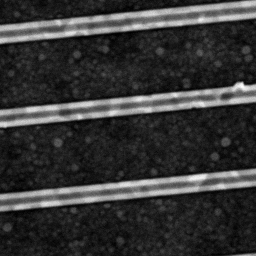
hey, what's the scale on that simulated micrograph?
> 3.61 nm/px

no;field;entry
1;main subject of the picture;one or a few lines or trenches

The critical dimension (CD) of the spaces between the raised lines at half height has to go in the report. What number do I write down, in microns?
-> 0.254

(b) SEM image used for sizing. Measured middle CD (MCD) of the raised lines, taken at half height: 49.3 nanometers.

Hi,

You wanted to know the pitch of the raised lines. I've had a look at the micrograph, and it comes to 302 nm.